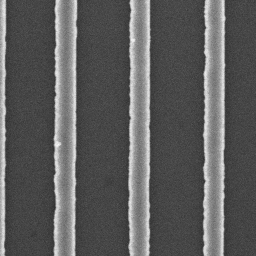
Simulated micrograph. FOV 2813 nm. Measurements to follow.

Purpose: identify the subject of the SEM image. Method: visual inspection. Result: lines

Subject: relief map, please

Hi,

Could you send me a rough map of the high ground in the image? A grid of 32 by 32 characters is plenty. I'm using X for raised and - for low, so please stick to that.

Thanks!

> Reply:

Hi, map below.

X------XXX------XXX-------XX----
X------XXX------XXX-------XX----
X------XXX------XXX-------XX----
X------XXX------XXX-------XX----
X------XXX------XXX-------XX----
X------XX-------XXX-------XX----
X------XX-------XXX-------XX----
X------XX-------XXX-------XX----
X------XX-------XXX-------XX----
X------XX-------XXX-------XX----
X------XX-------XXX-------XX----
X------XX-------XXX-------XX----
X------XX-------XXX-------XX----
X------XX-------XXX-------XX----
X------XX-------XXX-------XX----
X------XX-------XXX-------XX----
X------XX-------XXX-------XX----
X------XX-------XXX------XXX----
X------XX-------XXX-------XX----
X------XX-------XXX-------XX----
X------XX-------XXX-------XX----
X------XX-------XXX------XXX----
X------XX-------XXX-------XX----
X------XX-------XXX-------XX----
X------XX-------XXX-------XX----
X------XX-------XXX------XXX----
X------XX-------XXX------XXX----
X------XX-------XXX------XXX----
X------XX-------XXX------XXX----
X------XX-------XXX------XXX----
-------XX-------XXX-------XX----
X------XX-------XXX------XXX----